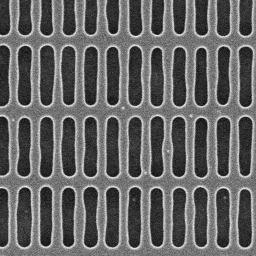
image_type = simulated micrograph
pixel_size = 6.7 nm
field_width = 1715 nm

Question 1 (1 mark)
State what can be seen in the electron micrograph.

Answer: groups of lines, slits or small figures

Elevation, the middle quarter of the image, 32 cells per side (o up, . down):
...oo....oo...oo....o....oo...oo
...oo....oo...oo....oo...oo...oo
...oo...ooo...oo...oo....oo...oo
...oo...ooo...oo...oo....oo...oo
...oo...ooo...oo....o....oo...oo
...oo...ooo...oo....o....oo....o
...oo...ooo...oo....o....oo....o
...oo...ooo...oo....o....oo....o
...oo...ooo...oo....o....oo....o
...oo...ooo..ooo...ooo...oo...oo
ooooooooooooooooo.oooo..oooo..oo
oooooooooooooooooooooooooooooooo
oooooooooooooooooooooooooooooooo
..ooo...ooo..oooo..ooo...ooo..oo
...oo...ooo...oo....o....oo...oo
...oo...ooo...oo....o....oo...oo
...oo...ooo...oo....o....oo...oo
...oo...oo....oo....o....oo...oo
...oo...oo....oo....o....oo...oo
...oo...oo....oo....o....oo...oo
...oo...oo....oo...oo....oo...oo
...oo...oo....oo...ooo...oo...oo
...oo....o....oo...ooo...oo....o
...oo...ooo...oo...ooo...oo....o
...oo...ooo...oo...ooo...oo....o
...oo...ooo...oo...ooo...oo...oo
...oo...oo....oo...oo....oo...oo
...oo...ooo...oo...ooo...oo...oo
ooooooooooooooooo.oooooooooooooo
oooooooooooooooooooooooooooooooo
oooooooooooooooooooooooooooooooo
...oo...ooo..ooo...ooo..oooo..oo